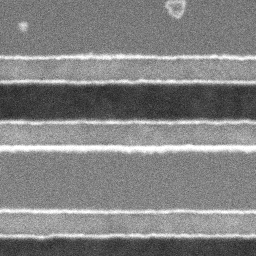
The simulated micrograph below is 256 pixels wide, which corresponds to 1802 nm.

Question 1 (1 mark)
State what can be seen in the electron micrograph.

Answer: lines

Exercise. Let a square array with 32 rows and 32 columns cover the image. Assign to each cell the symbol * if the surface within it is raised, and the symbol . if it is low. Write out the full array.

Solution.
********************************
********************************
********************************
********************************
********************************
********************************
********************************
................................
................................
................................
********************************
********************************
********************************
********************************
********************************
................................
................................
................................
..*...*.**.**.*.....*..**..***..
********************************
********************************
********************************
********************************
********************************
********************************
********************************
....*****************...********
................................
................................
*****.**************************
********************************
********************************